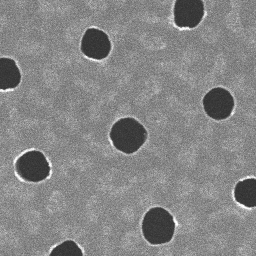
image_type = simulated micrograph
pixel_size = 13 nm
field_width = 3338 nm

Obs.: holes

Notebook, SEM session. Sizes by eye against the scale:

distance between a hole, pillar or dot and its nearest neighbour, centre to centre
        1250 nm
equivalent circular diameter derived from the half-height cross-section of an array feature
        422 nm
